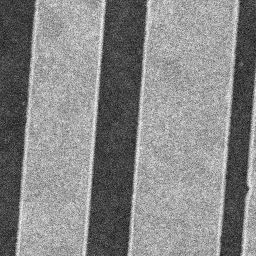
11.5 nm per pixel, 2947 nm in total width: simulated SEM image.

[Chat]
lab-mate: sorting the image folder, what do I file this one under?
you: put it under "one or a few lines or trenches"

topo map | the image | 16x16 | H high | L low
LLHHHHLLLHHHHHHL
LLHHHHLLLHHHHHHL
LLHHHHLLLHHHHHHL
LLHHHHLLLHHHHHHL
LLHHHHLLLHHHHHLL
LLHHHHLLLHHHHHLL
LLHHHHLLLHHHHHLL
LLHHHHLLLHHHHHLL
LLHHHHLLLHHHHHLL
LLHHHHLLLHHHHHLL
LLHHHHLLLHHHHHLL
LHHHHHLLHHHHHHLL
LHHHHLLLHHHHHHLL
LHHHHLLLHHHHHHLH
LHHHHLLLHHHHHHLH
LHHHHLLLHHHHHHLH